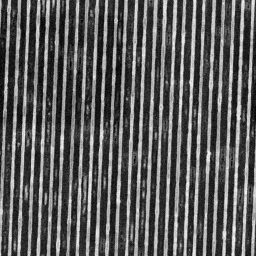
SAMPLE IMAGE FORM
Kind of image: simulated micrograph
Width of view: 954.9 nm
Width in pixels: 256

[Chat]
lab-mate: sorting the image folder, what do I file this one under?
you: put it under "parallel lines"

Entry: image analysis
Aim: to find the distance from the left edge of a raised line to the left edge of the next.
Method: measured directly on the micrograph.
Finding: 0.0363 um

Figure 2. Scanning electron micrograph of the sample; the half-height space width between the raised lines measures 27 nm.